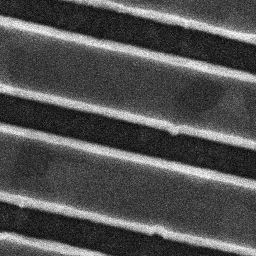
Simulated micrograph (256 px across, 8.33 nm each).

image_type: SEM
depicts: one or a few lines or trenches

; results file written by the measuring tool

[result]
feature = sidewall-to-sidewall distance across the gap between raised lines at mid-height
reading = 316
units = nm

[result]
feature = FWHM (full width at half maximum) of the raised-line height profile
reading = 557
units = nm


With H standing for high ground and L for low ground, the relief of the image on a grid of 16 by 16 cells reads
LLLLLLLLHHHHHHHH
HLLLLLLLLLLLHHHH
HHHHHLLLLLLLLLLL
HHHHHHHHHHLLLLLL
HHHHHHHHHHHHHHLL
HHHHHHHHHHHHHHHH
LLLLHHHHHHHHHHHH
LLLLLLLLLHHHHHHH
HHHLLLLLLLLLLHHH
HHHHHHHLLLLLLLLL
HHHHHHHHHHHLLLLL
HHHHHHHHHHHHHHHH
LHHHHHHHHHHHHHHH
LLLLLLHHHHHHHHHH
LLLLLLLLLLHHHHHH
HHHHLLLLLLLLLLHH